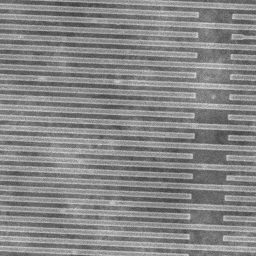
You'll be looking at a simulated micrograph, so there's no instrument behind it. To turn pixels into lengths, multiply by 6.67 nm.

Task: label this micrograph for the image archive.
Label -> parallel lines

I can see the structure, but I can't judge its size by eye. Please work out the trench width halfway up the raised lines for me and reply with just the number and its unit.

32.5 nanometres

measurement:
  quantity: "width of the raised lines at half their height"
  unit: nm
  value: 32.5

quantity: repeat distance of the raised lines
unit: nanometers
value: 67.3